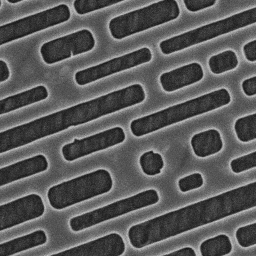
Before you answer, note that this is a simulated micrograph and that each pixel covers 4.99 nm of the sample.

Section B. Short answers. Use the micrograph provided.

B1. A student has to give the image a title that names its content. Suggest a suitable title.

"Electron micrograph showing parallel lines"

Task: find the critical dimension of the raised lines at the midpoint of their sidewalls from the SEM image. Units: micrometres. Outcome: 0.078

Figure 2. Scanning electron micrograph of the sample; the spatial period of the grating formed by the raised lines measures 170 nm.